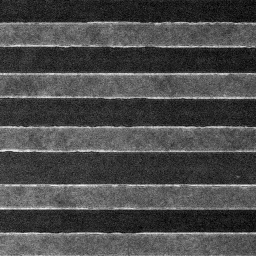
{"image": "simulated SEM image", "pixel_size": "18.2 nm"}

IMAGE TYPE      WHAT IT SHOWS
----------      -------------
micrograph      lines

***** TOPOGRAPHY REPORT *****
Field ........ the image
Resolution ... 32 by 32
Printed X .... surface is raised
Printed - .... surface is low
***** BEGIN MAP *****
--------------------------------
--------------------------------
--------------------------------
XXXXXXXXXXXXXXXXXXXXXXXXXXXXXXXX
XXXXXXXXXXXXXXXXXXXXXXXXXXXXXXXX
XXXXXXXXXXXXXXXXXXXXXXXXXXXXXXXX
--------------------------------
--------------------------------
--------------------------------
XXXXXXXXXXXXXXXXXXXXXXXXXXXXXXXX
XXXXXXXXXXXXXXXXXXXXXXXXXXXXXXXX
XXXXXXXXXXXXXXXXXXXXXXXXXXXXXXXX
--------------------------------
--------------------------------
--------------------------------
--------------------------------
XXXXXXXXXXXXXXXXXXXXXXXXXXXXXXXX
XXXXXXXXXXXXXXXXXXXXXXXXXXXXXXXX
XXXXXXXXXXXXXXXXXXXXXXXXXXXXXXXX
--------------------------------
--------------------------------
--------------------------------
--------------------------------
XXXXXXXXXXXXXXXXXXXXXXXXXXXXXXXX
XXXXXXXXXXXXXXXXXXXXXXXXXXXXXXXX
XXXXXXXXXXXXXXXXXXXXXXXXXXXXXXXX
--------------------------------
--------------------------------
--------------------------------
XXXXXXXXXXXXXXXXXXXXXXXXXXXXXXXX
XXXXXXXXXXXXXXXXXXXXXXXXXXXXXXXX
XXXXXXXXXXXXXXXXXXXXXXXXXXXXXXXX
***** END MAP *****